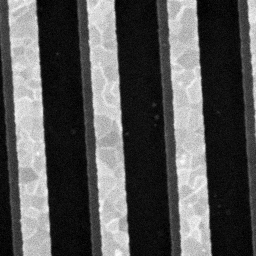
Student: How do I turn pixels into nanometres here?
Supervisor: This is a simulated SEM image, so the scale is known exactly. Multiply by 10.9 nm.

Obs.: lines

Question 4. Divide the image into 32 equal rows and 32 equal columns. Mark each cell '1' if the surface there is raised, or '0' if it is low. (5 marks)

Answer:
11110000001111000000111100000011
11110000001111000000111100000011
11111000001111000000111110000011
11111000001111000000111110000011
11111000001111000000111110000011
11111000001111100000111110000011
11111000001111100000111110000011
11111000001111100000111110000011
11111000001111100000111110000011
11111000001111100000111110000011
11111000001111100000111110000011
11111000001111100000111110000001
01111000001111100000111110000001
01111000001111100000011110000001
01111000000111100000011110000001
01111000000111100000011110000001
01111000000111100000011110000001
01111000000111100000011110000001
01111100000111100000011111000001
01111100000111100000011111000001
01111100000111100000011111000001
01111100000111110000011111000001
01111100000111110000011111000001
01111100000111110000011111000001
01111100000111110000011111000001
01111100000111110000011111000001
01111100000111110000011111000001
00111100000111110000011111000000
00111100000111110000011111000000
00111100000111110000011111000000
00111100000111110000011111000000
00111100000011110000011111000000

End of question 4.